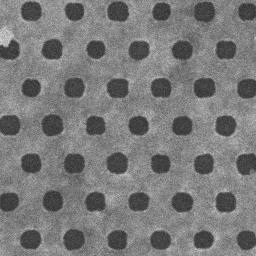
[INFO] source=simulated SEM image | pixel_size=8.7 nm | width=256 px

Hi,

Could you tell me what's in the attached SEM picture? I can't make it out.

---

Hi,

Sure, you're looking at a regular array of holes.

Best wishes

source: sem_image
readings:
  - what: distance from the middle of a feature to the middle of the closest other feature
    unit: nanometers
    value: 373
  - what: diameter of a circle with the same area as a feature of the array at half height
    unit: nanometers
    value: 189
